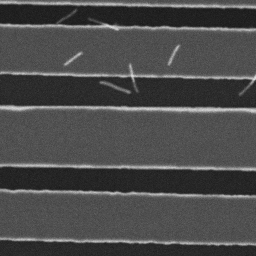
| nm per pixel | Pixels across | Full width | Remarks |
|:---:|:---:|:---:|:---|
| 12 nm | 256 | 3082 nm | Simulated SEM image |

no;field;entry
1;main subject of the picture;lines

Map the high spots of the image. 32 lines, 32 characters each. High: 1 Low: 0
00000111111111111111111111111111
00000000000000000000000000000000
00000000000000000000000000000000
11111111111111111111111111110000
11111111111111111111111111111111
11111111111111111111111111111111
11111111111111111111111111111111
11111111111111111111111111111111
11111111111111111111111111111111
00000000000000011111111111111111
00000000000000000000000000000000
00000000000000000000000000000000
00000000000000000000000000000000
11111111111111111111000000000000
11111111111111111111111111111111
11111111111111111111111111111111
11111111111111111111111111111111
11111111111111111111111111111111
11111111111111111111111111111111
11111111111111111111111111111111
11111111111111111111111111111111
00000000000000000000000000000000
00000000000000000000000000000000
00000000000000000000000000000000
11111111111111111111111111111111
11111111111111111111111111111111
11111111111111111111111111111111
11111111111111111111111111111111
11111111111111111111111111111111
11111111111111111111111111111111
00000000000000000000000000111111
00000000000000000000000000000000